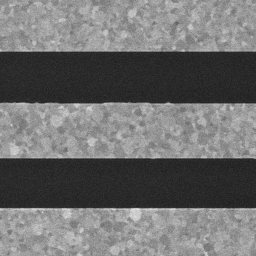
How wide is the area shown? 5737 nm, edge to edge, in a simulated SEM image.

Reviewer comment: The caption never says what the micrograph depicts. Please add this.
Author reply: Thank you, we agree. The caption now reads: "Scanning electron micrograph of lines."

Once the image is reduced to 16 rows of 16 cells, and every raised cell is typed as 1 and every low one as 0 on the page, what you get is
1111111111111111
1111111111111111
1111111111111111
0000000000000000
0000000000000000
0000000000000000
1101001111000000
1111111111111111
1111111111111111
1111111111111111
0000000000000000
0000000000000000
0000000000000000
1111111111111111
1111111111111111
1111111111111111